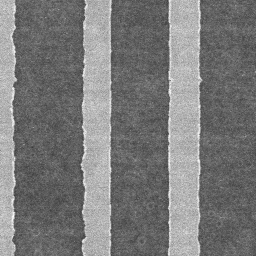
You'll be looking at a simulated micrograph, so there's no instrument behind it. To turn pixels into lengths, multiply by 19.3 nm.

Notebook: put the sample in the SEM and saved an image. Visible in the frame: one or a few lines or trenches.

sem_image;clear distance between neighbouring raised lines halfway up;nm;1240